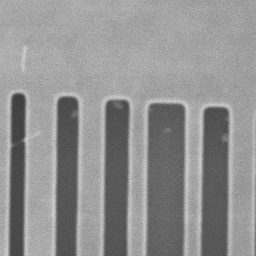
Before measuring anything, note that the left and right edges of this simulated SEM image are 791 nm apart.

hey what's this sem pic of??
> groups of lines, slits or small figures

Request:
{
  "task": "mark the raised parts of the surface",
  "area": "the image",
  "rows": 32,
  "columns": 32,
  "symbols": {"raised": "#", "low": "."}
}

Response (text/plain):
################################
################################
################################
################################
################################
################################
################################
################################
################################
################################
################################
################################
#..####...####..################
#..####...###...###....###..####
#..####...###...##.....##....###
#..####...###...##.....##....###
#..####...###...##.....##....###
#..####...###...##.....##....###
#..####...###...##.....##....###
#..####...###...##.....##....###
#..####...###...##.....##....###
#..####...###...##.....##....###
#..####...###...##.....##....###
#..####...###...##.....##....###
#..####...###...##.....##....###
#..####...###...##.....##....###
#..####...###...##.....##....###
#..####...###...##.....##....###
#..####...###...##.....##....###
#..####...###...##.....##...####
#..####...###...##.....##...####
#..####...###...##.....##...####